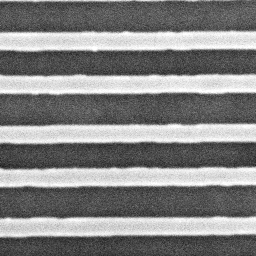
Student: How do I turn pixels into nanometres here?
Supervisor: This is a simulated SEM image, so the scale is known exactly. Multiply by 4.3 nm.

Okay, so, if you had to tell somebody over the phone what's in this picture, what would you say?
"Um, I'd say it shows lines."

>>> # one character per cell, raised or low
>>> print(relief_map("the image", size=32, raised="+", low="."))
................................
................................
................................
................................
++++++++++++++++++++++++++++++++
++++++++++++++++++++++++++++++++
................................
................................
................................
+........++.......++.+..++++++++
++++++++++++++++++++++++++++++++
++++++++++++++++++++.....+++....
................................
................................
................................
................................
++++++++++++++++++++++++++++++++
++++++++++++++++++++++++++++++++
................................
................................
................................
++++++++++++++++++++++++++++++++
++++++++++++++++++++++++++++++++
................................
................................
................................
................................
++++++++++++++++++++++++++++++++
++++++++++++++++++++++++++++++++
+++.............................
................................
................................